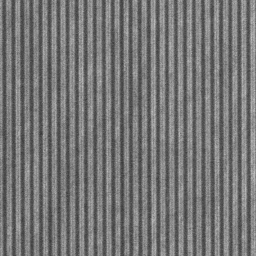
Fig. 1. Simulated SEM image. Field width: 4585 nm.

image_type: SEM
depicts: parallel lines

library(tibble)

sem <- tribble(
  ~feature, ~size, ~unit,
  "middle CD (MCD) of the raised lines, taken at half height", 78.4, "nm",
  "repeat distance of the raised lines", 162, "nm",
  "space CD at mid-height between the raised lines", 80.6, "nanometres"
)